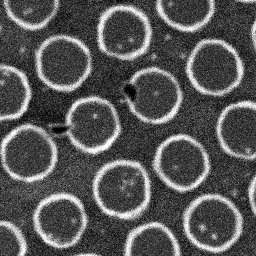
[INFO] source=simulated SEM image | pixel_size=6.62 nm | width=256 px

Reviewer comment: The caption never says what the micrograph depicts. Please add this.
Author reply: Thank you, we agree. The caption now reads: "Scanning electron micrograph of a regular array of raised bodies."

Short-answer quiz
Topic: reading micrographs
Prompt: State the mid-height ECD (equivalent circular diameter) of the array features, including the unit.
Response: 53.2 px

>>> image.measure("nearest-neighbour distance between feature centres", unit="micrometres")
0.447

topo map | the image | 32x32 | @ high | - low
-@@@@@@-------------@@@@@@@-----
-@@@@@@------@@@@---@@@@@@------
--@@@@-------@@@@@---@@@@@------
-------------@@@@@@----@@-------
-------------@@@@@@-------------
------@@@@---@@@@@-------@@@----
-----@@@@@@--@@@@@------@@@@@---
-----@@@@@@-------------@@@@@@--
@----@@@@@@------------@@@@@@@--
@@@--@@@@@@------@@@@---@@@@@@--
@@@---@@@@------@@@@@@--@@@@@@--
@@@@-----------@@@@@@@@---@@----
@@@@-------@@---@@@@@@@---------
@@@------@@@@@--@@@@@@------@@@@
@@-------@@@@@@--@@@@-------@@@@
--------@@@@@@@------------@@@@@
--@@@@@@@@@@@@@------------@@@@@
-@@@@@---@@@@@-------@@@----@@@@
@@@@@@@---@@@-------@@@@@---@@@@
@@@@@@@------------@@@@@@@----@@
@@@@@@@-------@@@--@@@@@@@------
-@@@@@-------@@@@@--@@@@@@------
---@--------@@@@@@---@@@@-------
------------@@@@@@@---@@-------@
-------@----@@@@@@@------------@
-----@@@@@--@@@@@@------@@@@@---
-----@@@@@---@@@@------@@@@@@@--
-----@@@@@@------------@@@@@@@--
@@---@@@@@--------@@@--@@@@@@@--
@@@--@@@@@------@@@@@---@@@@@@--
@@@---@@@-------@@@@@@---@@@@---
@@@-------------@@@@@@----------